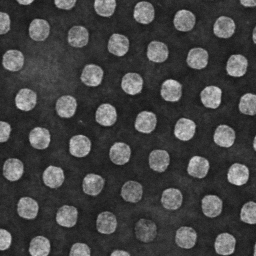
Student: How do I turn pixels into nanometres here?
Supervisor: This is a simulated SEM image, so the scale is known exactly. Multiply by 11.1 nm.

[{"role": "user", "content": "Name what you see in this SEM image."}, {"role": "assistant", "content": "a regular array of raised bodies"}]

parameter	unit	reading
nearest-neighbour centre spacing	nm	444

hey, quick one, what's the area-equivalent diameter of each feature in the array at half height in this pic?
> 243 nanometers